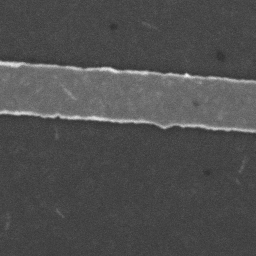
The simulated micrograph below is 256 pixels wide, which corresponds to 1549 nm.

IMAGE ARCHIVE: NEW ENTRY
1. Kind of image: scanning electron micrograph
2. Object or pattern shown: one or a few lines or trenches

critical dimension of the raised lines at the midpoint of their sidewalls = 306 nm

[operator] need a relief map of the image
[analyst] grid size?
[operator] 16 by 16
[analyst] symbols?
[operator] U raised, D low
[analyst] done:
DDDDDDDDDDDDDDDD
DDDDDDDDDDDDDDDD
DDDDDDDDDDDDDDDD
DDDDDDDDDDDDDDDD
UUUUUUUUUDDDDDDD
UUUUUUUUUUUUUUUU
UUUUUUUUUUUUUUUU
DDDDDDUUUUUUUUUU
DDDDDDDDDDDDDDDD
DDDDDDDDDDDDDDDD
DDDDDDDDDDDDDDDD
DDDDDDDDDDDDDDDD
DDDDDDDDDDDDDDDD
DDDDDDDDDDDDDDDD
DDDDDDDDDDDDDDDD
DDDDDDDDDDDDDDDD